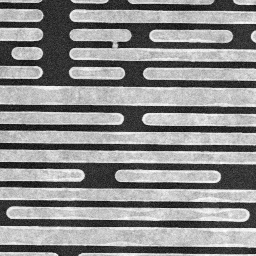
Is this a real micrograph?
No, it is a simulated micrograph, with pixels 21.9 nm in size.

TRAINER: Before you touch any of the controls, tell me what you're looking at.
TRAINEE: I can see groups of lines, slits or small figures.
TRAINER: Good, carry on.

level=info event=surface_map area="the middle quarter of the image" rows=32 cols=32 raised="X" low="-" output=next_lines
--------------------------------
--XXXXXXXXXXXXX-----XXXXXXXXXXXX
--XXXXXXXXXXXXX-----XXXXXXXXXXXX
----------XXXX-------XXXXXXXXXXX
--------------------------------
--------------------------------
XXXXXXXXXXXXXXXXXXXXXXXXXXXXXXXX
XXXXXXXXXXXXXXXXXXXXXXXXXXXXXXXX
XXXXXXXXXXXXXXXXXXXXXXXXXXXXXXXX
XXXXXXXXXXXXXXXXXXXXXXXXXXXXXXXX
--------------------------------
--------------------------------
XXXXXXXXXXXX----------------XX--
XXXXXXXXXXXXXXX-----XXXXXXXXXXXX
XXXXXXXXXXXXXX------XXXXXXXXXXXX
--------------------------------
--------------------------------
XXXXXXXXXXXXXXXXXXXXXXXXXXXXXXXX
XXXXXXXXXXXXXXXXXXXXXXXXXXXXXXXX
XXXXXXXXXXXXXXXXXXXXXXXXXXXXXXXX
--------------------------------
--------------------------------
XXXXXXXXXXXXXXXXXXXXXXXXXXXXXXXX
XXXXXXXXXXXXXXXXXXXXXXXXXXXXXXXX
----XXXXXXXXXXXXX---XXXXXXXXXXXX
--------------------------------
--------------XX----------------
XXXXX--------XXXXXXXXXXXXXXXXXXX
XXXXX--------XXXXXXXXXXXXXXXXXXX
--------------------------------
--------------------------------
XXXXXXXXXXXXXXXXXXXXXXXXXXXXXXXX